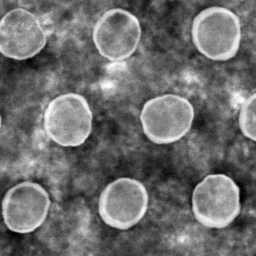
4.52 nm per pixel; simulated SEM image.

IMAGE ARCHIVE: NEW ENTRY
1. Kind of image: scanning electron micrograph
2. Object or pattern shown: raised bodies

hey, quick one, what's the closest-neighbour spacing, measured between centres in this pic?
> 96.7 px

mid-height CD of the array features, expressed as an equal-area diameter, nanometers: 222